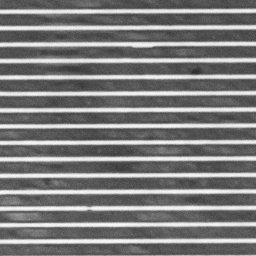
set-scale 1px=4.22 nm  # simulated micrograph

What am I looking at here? parallel lines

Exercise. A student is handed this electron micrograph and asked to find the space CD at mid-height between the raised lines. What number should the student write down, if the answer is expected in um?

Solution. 0.0565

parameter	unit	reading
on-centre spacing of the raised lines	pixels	16.4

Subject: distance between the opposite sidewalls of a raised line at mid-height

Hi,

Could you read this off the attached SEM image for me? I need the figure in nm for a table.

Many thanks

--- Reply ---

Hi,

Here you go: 12.1